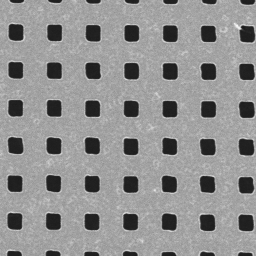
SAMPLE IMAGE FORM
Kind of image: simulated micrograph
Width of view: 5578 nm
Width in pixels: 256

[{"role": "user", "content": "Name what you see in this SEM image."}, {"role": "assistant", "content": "a regular array of holes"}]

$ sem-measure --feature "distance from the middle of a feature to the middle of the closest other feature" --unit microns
0.819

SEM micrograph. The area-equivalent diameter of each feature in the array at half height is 383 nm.